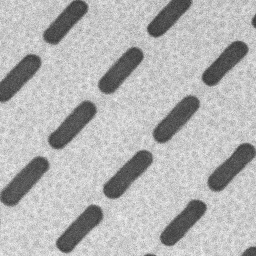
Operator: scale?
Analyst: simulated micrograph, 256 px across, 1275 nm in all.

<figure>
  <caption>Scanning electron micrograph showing holes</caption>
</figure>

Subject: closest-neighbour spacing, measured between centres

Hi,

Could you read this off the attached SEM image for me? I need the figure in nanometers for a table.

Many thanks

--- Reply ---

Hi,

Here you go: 361